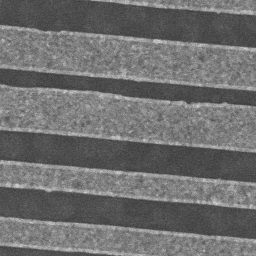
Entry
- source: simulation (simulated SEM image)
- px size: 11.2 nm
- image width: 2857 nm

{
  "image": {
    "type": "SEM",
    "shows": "one or a few lines or trenches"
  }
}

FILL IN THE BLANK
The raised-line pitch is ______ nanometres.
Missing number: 691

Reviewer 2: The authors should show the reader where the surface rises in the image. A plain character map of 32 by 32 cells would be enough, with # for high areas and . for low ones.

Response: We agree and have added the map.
.................###############
..............................##
................................
##..............................
#############...................
#######################.........
################################
################################
..##############################
.............###################
........................########
###########.....................
#################...............
################################
################################
################################
......##########################
.................###############
............................####
................................
###.............................
###############.................
##########################......
.....###########################
................################
...........................#####
................................
##..............................
###############.................
#########################.......
.###############################
............####################